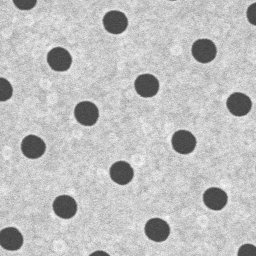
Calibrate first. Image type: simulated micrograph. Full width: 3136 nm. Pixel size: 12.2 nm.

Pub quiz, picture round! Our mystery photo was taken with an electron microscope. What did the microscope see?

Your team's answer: a regular array of holes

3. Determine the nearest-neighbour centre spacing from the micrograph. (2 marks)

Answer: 793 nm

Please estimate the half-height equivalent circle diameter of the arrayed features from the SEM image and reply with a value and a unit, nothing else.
311 nanometers